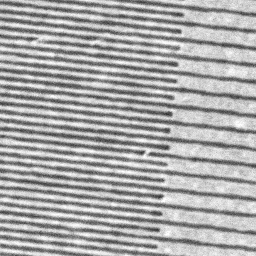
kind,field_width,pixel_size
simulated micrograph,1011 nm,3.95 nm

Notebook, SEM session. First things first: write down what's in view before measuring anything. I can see parallel lines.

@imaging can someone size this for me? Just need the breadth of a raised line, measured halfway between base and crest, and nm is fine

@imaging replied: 10.3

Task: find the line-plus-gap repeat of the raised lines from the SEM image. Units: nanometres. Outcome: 32.9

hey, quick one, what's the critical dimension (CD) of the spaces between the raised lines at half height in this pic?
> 21.1 nm